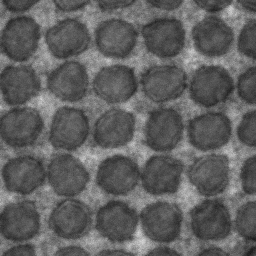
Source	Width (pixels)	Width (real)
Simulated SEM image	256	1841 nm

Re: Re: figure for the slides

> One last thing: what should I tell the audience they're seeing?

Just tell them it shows a regular array of raised bodies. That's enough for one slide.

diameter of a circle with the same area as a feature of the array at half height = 254 nm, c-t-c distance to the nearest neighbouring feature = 0.324 micrometres